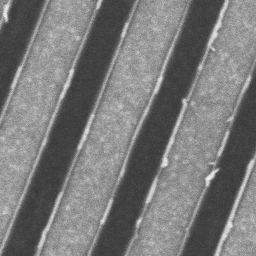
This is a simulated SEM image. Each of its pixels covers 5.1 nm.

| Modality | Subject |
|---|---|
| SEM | one or a few lines or trenches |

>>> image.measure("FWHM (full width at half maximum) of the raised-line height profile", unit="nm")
190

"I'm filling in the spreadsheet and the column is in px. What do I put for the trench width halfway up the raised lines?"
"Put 46.3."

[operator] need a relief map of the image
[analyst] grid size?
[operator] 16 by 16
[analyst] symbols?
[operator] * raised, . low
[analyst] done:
***...**....**..
**....**...***..
**...***...**...
**...**...***...
*...***...***...
*...**....**...*
....**...***...*
...***...**...**
...**...***...**
..***...***...**
..***...**...***
..**...***...**.
.***...**...***.
.**...***...***.
***...***...**..
***...**...***..